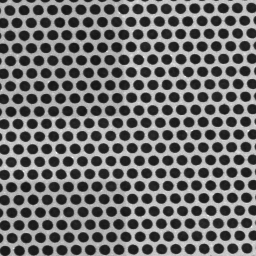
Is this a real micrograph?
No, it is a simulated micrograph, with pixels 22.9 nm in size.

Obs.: a regular array of holes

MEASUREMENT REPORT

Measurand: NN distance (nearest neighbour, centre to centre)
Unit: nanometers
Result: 320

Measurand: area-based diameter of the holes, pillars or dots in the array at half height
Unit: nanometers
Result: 242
